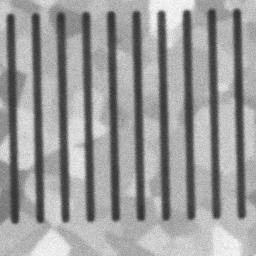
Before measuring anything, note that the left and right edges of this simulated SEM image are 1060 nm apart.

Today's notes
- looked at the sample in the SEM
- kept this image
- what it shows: groups of lines, slits or small figures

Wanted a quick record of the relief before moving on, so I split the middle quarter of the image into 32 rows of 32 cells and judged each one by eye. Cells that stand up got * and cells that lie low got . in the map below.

.****..****..****...***...****..
.****..****..****...***...****..
.****..****..****...****..****..
.****..****..****...****..****..
.****..****..****...****..****..
.****..****..****...****..****..
.****..****..****...****..****..
.****..****...***...****..****..
.****..****...***...****..****..
.****..****...***...****..****..
.****..****...****..****..****..
.****..****...****..****..****..
.****..****...****..****..****..
.****..****...****..****..****..
.****..****...****..****..****..
.****..****...****..****..****..
.****..****...****..****..****..
.****..****...****..****..****..
.****..****...****..****..****..
.****..****...****..****..****..
.****..****...****..****..****..
.****..****...****..****..****..
.****..****...****..****..****..
.****...***...****..****..****..
.****...***...****..****..****..
.****...***...****..****..****..
.****...***...****..****..****..
.****...***...****..****..****..
.****...****..****..****...***..
.****...****..****..****...***..
.****...****..****..****...***..
.****...****..****..****...***..